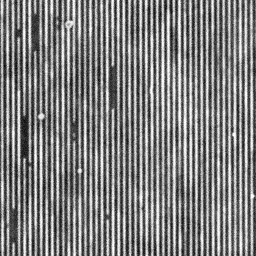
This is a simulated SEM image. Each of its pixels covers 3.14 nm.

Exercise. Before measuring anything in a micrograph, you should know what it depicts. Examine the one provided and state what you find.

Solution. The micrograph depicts parallel lines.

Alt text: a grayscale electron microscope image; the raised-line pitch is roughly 17.4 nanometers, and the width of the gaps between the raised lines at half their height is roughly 0.0141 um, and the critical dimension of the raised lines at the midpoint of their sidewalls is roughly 3.1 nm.